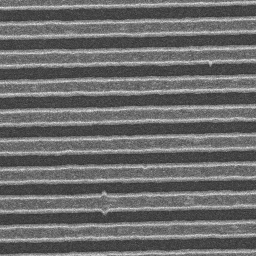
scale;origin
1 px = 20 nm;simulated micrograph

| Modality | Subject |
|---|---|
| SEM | parallel lines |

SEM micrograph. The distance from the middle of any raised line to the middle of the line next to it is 581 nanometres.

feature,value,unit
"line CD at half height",0.3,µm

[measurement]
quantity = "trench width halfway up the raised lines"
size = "280 nanometers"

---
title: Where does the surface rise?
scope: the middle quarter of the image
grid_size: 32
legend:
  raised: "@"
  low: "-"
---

--------------------------------
--------------------------------
--------------------------------
--------------------@@@@----@@@@
@@@@@@@@@@@@@@@@@@@@@@@@@@@@@@@@
@@@@@@@@@@@@@@@@@@@@@@@@@@@@@@@@
@@@@@@@@@@@@@@@@@@@@@@@@@@@@@@@@
@@---@@@@-------@---------------
--------------------------------
--------------------------------
--------------------------------
@@@@@@@@@@@@@@@@@@@@@@@@@@@@@@@@
@@@@@@@@@@@@@@@@@@@@@@@@@@@@@@@@
@@@@@@@@@@@@@@@@@@@@@@@@@@@@@@@@
@@@@@@@@@@@@@@@@@@@@@-----------
--------------------------------
--------------------------------
--------------------------------
---------@@@@@@@@@@@@@@@@@@@@@@@
@@@@@@@@@@@@@@@@@@@@@@@@@@@@@@@@
@@@@@@@@@@@@@@@@@@@@@@@@@@@@@@@@
@@@@@@@@@@@@@@@@@@@@@@@@@@@@@@@@
--------------------------------
--------------------------------
--------------------------------
----------@@@@@@@@---@@@@@@@@@@@
@@@@@@@@@@@@@@@@@@@@@@@@@@@@@@@@
@@@@@@@@@@@@@@@@@@@@@@@@@@@@@@@@
@@@@@@@@@@@@@@@@@@@@@@@@@@@@@@@@
---@--@@@-----------------------
--------------------------------
--------------------------------